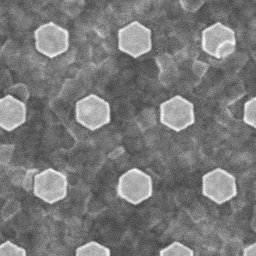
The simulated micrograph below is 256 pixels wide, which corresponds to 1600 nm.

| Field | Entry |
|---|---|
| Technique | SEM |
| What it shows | a regular array of raised bodies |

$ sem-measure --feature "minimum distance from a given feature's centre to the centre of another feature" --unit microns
0.521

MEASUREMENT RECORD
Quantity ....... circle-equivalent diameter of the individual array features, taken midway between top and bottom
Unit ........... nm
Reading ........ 204